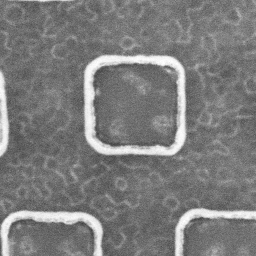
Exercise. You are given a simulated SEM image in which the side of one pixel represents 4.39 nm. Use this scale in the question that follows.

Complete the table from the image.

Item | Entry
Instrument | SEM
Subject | raised bodies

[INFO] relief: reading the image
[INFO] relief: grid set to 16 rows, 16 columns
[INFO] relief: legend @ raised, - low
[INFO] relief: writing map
----------------
----------------
----------------
----------------
------@@@@@-----
-----@@@@@@-----
-----@@@@@@-----
-----@@@@@@-----
------@@@@@-----
----------------
----------------
----------------
----------------
-@@@@-------@@@@
@@@@@@-----@@@@@
@@@@@@-----@@@@@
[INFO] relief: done